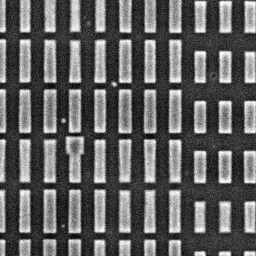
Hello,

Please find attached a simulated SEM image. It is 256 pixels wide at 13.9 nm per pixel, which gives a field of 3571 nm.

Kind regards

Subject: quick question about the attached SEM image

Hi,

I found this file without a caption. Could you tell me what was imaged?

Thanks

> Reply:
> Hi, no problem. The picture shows wiring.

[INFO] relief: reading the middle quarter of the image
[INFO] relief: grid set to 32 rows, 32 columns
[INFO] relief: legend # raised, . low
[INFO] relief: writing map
..##....##....###...##.....##...
..##....##....###...##.....##...
..##....##....###...##.....##...
..##....##....###...###....##...
................................
................................
................................
.###....##....###...###....##...
.###....##....###...###...###...
.###....##....###...###...###...
.###....##....###...###...###...
.###....##....###...###...###...
.###....##....###...###...###...
.###....##....###...###...###...
.###....##....###...###...###...
.###....##....###...###...###...
..##....##....###...###...###...
................................
.###............................
.####...##....###...###....##...
.####...##....###...###....##...
.####...##....###...###....##...
.###....##....##....###....##...
..##....##....##....##.....##...
..##....##....##.....#.....##...
..##....##....##.....#.....##...
..##....##....##.....#.....##...
..##....##....##.....#.....##...
..##....##....##.....#.....##...
................................
................................
................................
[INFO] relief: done